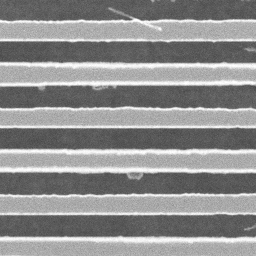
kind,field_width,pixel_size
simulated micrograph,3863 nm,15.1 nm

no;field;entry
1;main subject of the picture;lines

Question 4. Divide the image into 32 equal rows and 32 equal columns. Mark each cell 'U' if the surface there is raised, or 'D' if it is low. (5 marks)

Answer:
DDDDDDDDDDDDDDDDDDDDDDDDDDDDDDDD
DDDDDDDDDDDDDDDDDDDDDDDDDDDDDDDD
DDDDDDDDDDDDDDDDUDDDDDDDDDDDDDDD
UUUUUUUUUUUUUUUUUUUUUUUUUUUUUUUU
UUUUUUUUUUUUUUUUUUUUUUUUUUUUUUUU
DDDDDDDDDDDDDDDDDDDDDDDDDDDDDDDD
DDDDDDDDDDDDDDDDDDDDDDDDDDDDDDDD
DDDDDDDDDDDDDDDDDDDDDDDDDDDDDDDD
UUUUUUUUUUUUUUUUUUUUUUUUUUUUUUUU
UUUUUUUUUUUUUUUUUUUUUUUUUUUUUUUU
UUUUUUUUUUUUUUUUUUUUUUUUUUUDDDDD
DDDDDDDDDDDDDDDDDDDDDDDDDDDDDDDD
DDDDDDDDDDDDDDDDDDDDDDDDDDDDDDDD
DDDDDDDDDDDDDDDUUDDDDDDDDDDDDDDD
UUUUUUUUUUUUUUUUUUUUUUUUUUUUUUUU
UUUUUUUUUUUUUUUUUUUUUUUUUUUUUUUU
DDDDDDDDDDDDDDDDDDDDDDDDDDDDDDDD
DDDDDDDDDDDDDDDDDDDDDDDDDDDDDDDD
DDDDDDDDDDDDDDDDDDDDDDDDDDDDDDDD
UUUUUUUUUUUUUUUUUUUUUUUUUUUUUUUU
UUUUUUUUUUUUUUUUUUUUUUUUUUUUUUUU
DDDDDDDDDDDDDDDDDDDDDDDDDDDDDDUD
DDDDDDDDDDDDDDDDDDDDDDDDDDDDDDDD
DDDDDDDDDDDDDDDDDDDDDDDDDDDDDDDD
UUUUUUUUUUUUUUUUUUUUUUUUUUUUUUUU
UUUUUUUUUUUUUUUUUUUUUUUUUUUUUUUU
UUUUUUUUUUUUUUUUUUUUUUUUUUUUUUUU
DDDDDDDDDDDDDDDDDDDDDDDDDDDDDDDD
DDDDDDDDDDDDDDDDDDDDDDDDDDDDDDDD
DDDDDDDDDDDDDDDDDDDDDDDDDDDDDDDD
UUUUUUUUUUUUUUUUUUUUUUUUUUUUUUUU
UUUUUUUUUUUUUUUUUUUUUUUUUUUUUUUU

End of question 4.